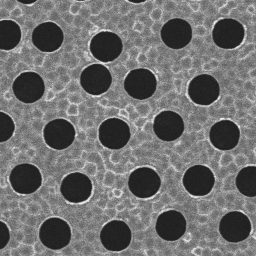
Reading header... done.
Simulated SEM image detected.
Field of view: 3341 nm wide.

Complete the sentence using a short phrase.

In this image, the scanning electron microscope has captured a regular array of holes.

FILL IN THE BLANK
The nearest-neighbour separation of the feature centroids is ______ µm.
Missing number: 0.666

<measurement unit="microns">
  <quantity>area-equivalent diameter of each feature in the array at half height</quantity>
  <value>0.411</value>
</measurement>